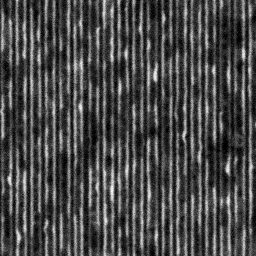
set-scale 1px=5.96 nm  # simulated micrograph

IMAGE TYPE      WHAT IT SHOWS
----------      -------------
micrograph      parallel lines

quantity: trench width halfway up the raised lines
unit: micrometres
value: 0.0298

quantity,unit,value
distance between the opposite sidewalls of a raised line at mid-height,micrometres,0.0588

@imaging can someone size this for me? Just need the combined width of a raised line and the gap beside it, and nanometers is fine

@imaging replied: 86.8